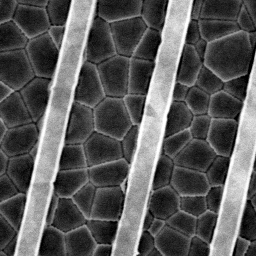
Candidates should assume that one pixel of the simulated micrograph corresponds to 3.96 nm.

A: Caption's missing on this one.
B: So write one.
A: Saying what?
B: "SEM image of one or a few lines or trenches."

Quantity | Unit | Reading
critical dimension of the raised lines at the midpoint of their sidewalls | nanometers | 81.6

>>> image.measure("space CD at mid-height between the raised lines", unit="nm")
292